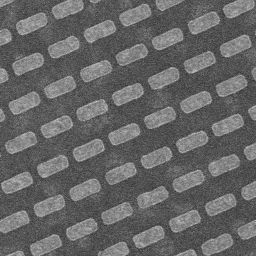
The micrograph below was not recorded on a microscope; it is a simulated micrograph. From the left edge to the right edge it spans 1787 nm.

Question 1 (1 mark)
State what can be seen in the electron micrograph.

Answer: a regular array of raised bodies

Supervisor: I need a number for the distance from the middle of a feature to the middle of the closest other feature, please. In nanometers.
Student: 273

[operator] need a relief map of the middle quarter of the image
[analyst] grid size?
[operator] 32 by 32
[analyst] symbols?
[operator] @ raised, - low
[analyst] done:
-------@@@@@------------------@@
-----@@@@@@@--------------@@---@
----@@@@@@@------------@@@@@@---
@@---@@@--------------@@@@@@@---
@@@------------------@@@@@@-----
@@@--------------@@---@@@-------
@@------------@@@@@@------------
------------@@@@@@@-------------
------------@@@@@@-------------@
--------@@---@@@--------------@@
-----@@@@@@------------------@@@
----@@@@@@@-------------@@@---@@
---@@@@@@-------------@@@@@@----
@---@@@-------------@@@@@@@@----
@@------------------@@@@@@------
@@--------------@@---@@@--------
-------------@@@@@@-------------
-----------@@@@@@@@-------------
-----------@@@@@@-------------@@
-------@@---@@@-------------@@@@
----@@@@@@------------------@@@@
---@@@@@@@-------------@@@---@@-
--@@@@@@-------------@@@@@@-----
@--@@@-------------@@@@@@@@-----
@------------------@@@@@@-------
@-------------@@@@--@@@---------
------------@@@@@@--------------
-----------@@@@@@@-------------@
----------@@@@@@-------------@@@
-----@@@@--@@--------------@@@@@
---@@@@@@------------------@@@@@
--@@@@@@@-------------@@@---@@--